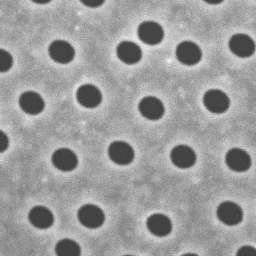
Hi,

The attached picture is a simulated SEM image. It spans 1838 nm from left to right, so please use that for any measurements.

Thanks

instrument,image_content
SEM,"a regular array of holes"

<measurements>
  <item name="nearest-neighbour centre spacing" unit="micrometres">0.388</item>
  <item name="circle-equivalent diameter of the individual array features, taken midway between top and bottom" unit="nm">186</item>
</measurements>